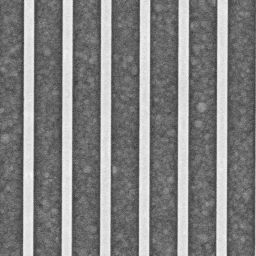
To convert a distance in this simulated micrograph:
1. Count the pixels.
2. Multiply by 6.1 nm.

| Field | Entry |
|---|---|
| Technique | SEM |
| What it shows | parallel lines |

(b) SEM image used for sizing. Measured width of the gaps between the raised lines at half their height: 176 nanometres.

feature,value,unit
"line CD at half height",60.3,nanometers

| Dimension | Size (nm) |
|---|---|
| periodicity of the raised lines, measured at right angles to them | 236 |